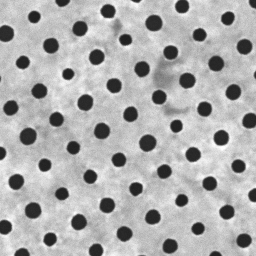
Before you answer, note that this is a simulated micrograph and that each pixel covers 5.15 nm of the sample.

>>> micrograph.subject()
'a regular array of holes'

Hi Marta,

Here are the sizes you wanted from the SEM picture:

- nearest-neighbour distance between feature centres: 0.17 um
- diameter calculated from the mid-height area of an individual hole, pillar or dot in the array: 15.1 pixels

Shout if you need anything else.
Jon